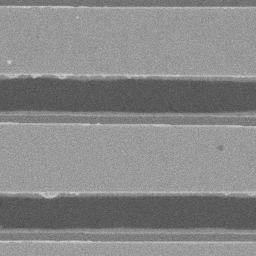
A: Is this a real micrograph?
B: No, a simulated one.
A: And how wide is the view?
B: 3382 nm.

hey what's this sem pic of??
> lines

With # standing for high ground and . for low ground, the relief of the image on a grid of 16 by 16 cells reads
################
################
################
################
################
................
................
################
################
################
################
################
................
................
................
################